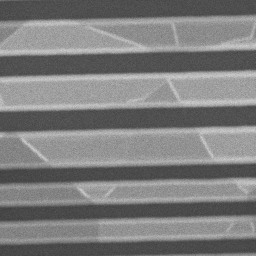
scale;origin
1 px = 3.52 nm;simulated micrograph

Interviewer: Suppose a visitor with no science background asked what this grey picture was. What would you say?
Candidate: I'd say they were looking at groups of lines, slits or small figures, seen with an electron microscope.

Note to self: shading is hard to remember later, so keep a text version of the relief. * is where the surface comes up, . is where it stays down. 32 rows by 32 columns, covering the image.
................................
................................
....................************
********************************
********************************
********************************
*******.........................
................................
................................
...................*************
********************************
********************************
********************************
******..........................
................................
................................
............********************
********************************
********************************
********************************
**************..................
................................
................................
********************************
********************************
***.............................
................................
........................********
********************************
********************************
................................
................................